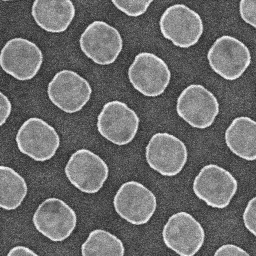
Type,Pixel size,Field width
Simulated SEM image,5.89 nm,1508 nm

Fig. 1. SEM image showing a regular array of raised bodies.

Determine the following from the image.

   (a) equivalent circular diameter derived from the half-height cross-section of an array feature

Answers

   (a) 0.238 um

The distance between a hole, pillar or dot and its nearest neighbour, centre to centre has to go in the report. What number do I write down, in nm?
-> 338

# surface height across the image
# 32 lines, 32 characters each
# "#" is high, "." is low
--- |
....#####.....#####...........##
....#####.......##...###......##
....#####...........#####......#
.....###...###......#####.......
..........#####......####.......
.###......#####.......##...###..
#####......####...........#####.
#####.......##...###......#####.
#####...........#####......####.
..##...###......#####.......##..
......#####......####...........
......#####.......##...###......
#.....#####...........#####.....
#......###...###......#####.....
#...........#####......####.....
...###......#####.......##...###
..#####.....#####...........####
..#####.......##...###......####
..#####...........#####......###
....##...###......#####.......##
........#####......####.........
##......#####.......##...###....
###......####...........#####...
###.......##...###......#####...
###............####......####...
##...###......#####.......##...#
....#####......####............#
....#####.......##...###.......#
.....####............####......#
......##...###......#####.......
..........#####......####.......
.###......#####.......##...####.